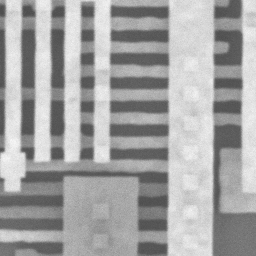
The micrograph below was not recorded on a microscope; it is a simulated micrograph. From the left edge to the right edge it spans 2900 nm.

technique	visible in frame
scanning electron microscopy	wiring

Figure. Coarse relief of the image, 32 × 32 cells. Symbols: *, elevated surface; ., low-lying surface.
.**..*..**..**.......******...**
.**..*..**..**.......******...**
.**..*..**..**.......******...**
.**.**..**..**.......******...**
.**.**..**..**.......******...**
.**..*..**..**.......******...**
.**.**..**..**.......******...**
.**.**..**..**.......******...**
.**.**..**..**.......******...**
.**.**..**..**.......******...**
.**.**..**..**.......******...**
.**.**..**..**.......******...**
.**.**..**..**.......******...**
.**.**..**..**.......******...**
.**.**..**..**.......******...**
.**.**..**..**.......******...**
.*..**..**..**.......******...**
.*..**..**..**.......******...**
.*..**..**..**.......******...**
***.**..**..**.......******...**
***..................******...**
***..................******...**
***.....*********....******...**
.*......*********....******...**
........*********....******.....
........*********....******.....
........*********....******.....
........*********....******.....
........*********....******.....
........*********....******.....
........*********....******.....
........*********....******.....